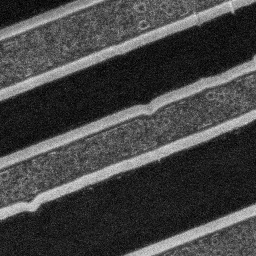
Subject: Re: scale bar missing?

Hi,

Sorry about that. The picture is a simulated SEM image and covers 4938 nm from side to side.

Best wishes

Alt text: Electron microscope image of one or a few lines or trenches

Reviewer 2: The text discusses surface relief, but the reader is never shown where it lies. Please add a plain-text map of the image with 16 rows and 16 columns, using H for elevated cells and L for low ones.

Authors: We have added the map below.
LLLLHHHHHHHHHHLL
LLHHHHHHHHHLLLLL
HHHHHHHHHLLLLLLL
HHHHHHLLLLLLLLLL
HHHHLLLLLLLLLLLH
HLLLLLLLLLLLHHHH
LLLLLLLLLLHHHHHH
LLLLLLLHHHHHHHHL
LLLLLHHHHHHHHLLL
LLHHHHHHHHLLLLLL
HHHHHHHLLLLLLLLL
HHHHHLLLLLLLLLLL
HHHLLLLLLLLLLLLL
LLLLLLLLLLLLLLLH
LLLLLLLLLLLLLHHH
LLLLLLLLLLHHHHHH